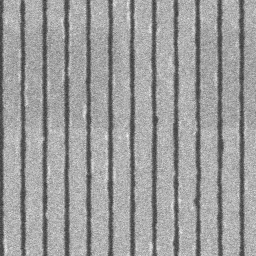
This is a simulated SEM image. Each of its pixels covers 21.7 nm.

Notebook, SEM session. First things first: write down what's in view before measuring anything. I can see parallel lines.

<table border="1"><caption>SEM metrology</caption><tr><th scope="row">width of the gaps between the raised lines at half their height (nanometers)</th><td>329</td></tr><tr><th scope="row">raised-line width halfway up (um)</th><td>0.144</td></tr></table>